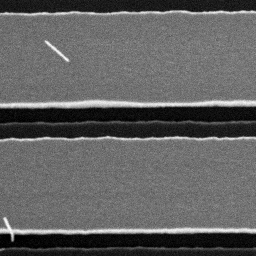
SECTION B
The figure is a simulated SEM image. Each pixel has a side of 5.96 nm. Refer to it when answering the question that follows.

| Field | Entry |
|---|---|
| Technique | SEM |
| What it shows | lines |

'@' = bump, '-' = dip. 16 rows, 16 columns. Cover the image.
----------------
@@@@@@@@@@@@@@@@
@@@@@@@@@@@@@@@@
@@@@@@@@@@@@@@@@
@@@@@@@@@@@@@@@@
@@@@@@@@@@@@@@@@
@@@@@@@@@@@@@@@@
----------------
----------------
@@@@@@@@@@@@@@@@
@@@@@@@@@@@@@@@@
@@@@@@@@@@@@@@@@
@@@@@@@@@@@@@@@@
@@@@@@@@@@@@@@@@
@@@@@@@@@@@@---@
----------------